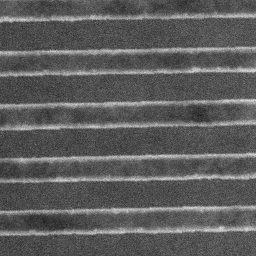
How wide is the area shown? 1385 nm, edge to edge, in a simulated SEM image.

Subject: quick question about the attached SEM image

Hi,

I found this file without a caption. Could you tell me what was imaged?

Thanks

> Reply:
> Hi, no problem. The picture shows lines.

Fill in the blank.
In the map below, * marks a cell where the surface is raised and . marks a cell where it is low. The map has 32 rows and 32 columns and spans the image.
********************************
********************************
................................
................................
................................
................................
.........***********************
********************************
********************************
................................
................................
................................
................................
********************************
********************************
****************************....
................................
................................
................................
.............................***
********************************
********************************
********........................
................................
................................
................................
......**************************
********************************
********************************
................................
................................
................................